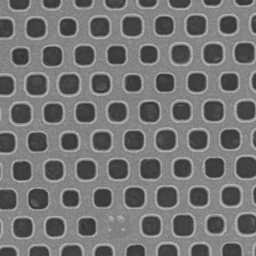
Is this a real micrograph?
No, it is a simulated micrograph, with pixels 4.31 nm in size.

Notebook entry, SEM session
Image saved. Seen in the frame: a regular array of holes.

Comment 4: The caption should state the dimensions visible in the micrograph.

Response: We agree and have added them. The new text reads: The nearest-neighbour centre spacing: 138 nanometres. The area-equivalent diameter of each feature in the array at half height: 93.1 nm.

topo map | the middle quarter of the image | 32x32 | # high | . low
####..##########################
################################
...#####...#############...####.
....###.....###....####....####.
....###.....###.....###.....###.
....###.....###.....###.....###.
....###.....###....####....####.
...#####..######################
################################
#####.##############...#####...#
###.....###.....###.....###.....
###.....###.....###.....###.....
###.....###.....###.....###.....
###.....###.....###.....###.....
####...#####...#####...#########
################################
#################.######...#####
...####.....###.....###.....###.
....###.....###.....###.....###.
....###.....###.....###.....###.
....###.....###.....###.....###.
..######...#####...#####...#####
################################
#####################.##########
###.....###.....###.....###.....
###.....###.....###.....###.....
###.....###.....###.....###.....
###.....###.....###.....###.....
####....####...#####....#####..#
################################
################################
..######....###.....###.....###.